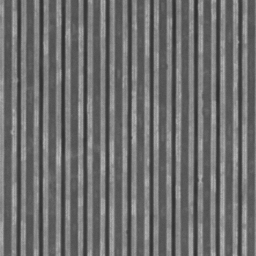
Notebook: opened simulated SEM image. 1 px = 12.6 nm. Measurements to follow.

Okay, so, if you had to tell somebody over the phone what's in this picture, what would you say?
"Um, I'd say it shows parallel lines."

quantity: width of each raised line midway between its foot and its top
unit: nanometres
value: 62.7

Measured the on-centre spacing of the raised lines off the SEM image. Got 138 nanometres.